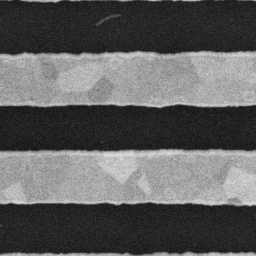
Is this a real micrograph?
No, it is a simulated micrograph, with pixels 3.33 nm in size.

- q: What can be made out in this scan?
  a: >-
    lines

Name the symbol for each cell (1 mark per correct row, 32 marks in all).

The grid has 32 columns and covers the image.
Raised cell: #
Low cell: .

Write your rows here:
................................
................................
................................
................................
................................
................................
................................
################################
################################
################################
################################
################################
################################
................................
................................
................................
................................
................................
................................
################################
################################
################################
################################
################################
################################
..............#..........#######
................................
................................
................................
................................
................................
................................